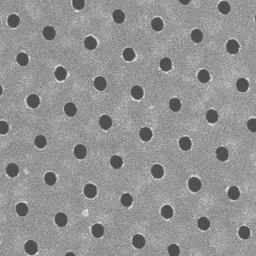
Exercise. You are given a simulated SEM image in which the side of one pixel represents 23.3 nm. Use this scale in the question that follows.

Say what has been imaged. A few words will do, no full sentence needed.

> a regular array of holes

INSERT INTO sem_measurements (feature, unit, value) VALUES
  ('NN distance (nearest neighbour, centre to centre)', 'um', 0.891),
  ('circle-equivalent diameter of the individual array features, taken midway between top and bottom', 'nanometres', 322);